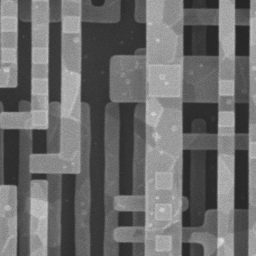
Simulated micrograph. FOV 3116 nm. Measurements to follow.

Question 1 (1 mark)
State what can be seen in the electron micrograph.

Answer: wiring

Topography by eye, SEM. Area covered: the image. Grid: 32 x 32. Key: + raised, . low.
++..++..++........+++++....++..+
++..++..++........+++++....++..+
++..++..++........+++++....++..+
++..++..++........+++++....++..+
++..++..++........+++++....++..+
++..++..++........+++++....++..+
++..++..++........+++++....++..+
++..++..++........+++++....++..+
++..++..++........+++++....++..+
++..++..++........+++++....++..+
++..++..++........+++++....++..+
....++..++........+++++....++..+
....++..++........+++++....++..+
....++..++........+++++....++..+
++++++..++........+++++....++..+
++++++..++........+++++....++..+
........++........+++++....++..+
........++........+++++....++..+
........++........+++++....++..+
....++++++........+++++....++..+
....++++++........+++++....++..+
....++++++........+++++....++..+
..................+++++....++..+
++..++............+++++....++..+
++..++............+++++....++..+
++..++............+++++....++..+
++..++............+++++....++..+
++..++............+++++....++..+
++..++............+++++....++..+
++..++............+++++....++..+
++..++............+++++....++..+
++..++............+++++....++..+